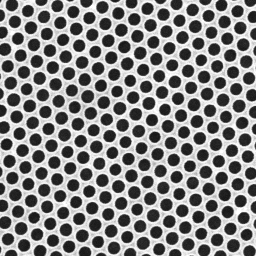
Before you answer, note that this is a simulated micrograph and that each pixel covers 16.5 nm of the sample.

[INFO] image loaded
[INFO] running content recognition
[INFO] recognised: a regular array of holes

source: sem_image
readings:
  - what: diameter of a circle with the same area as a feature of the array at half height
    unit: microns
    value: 0.216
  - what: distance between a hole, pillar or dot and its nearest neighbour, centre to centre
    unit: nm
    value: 278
